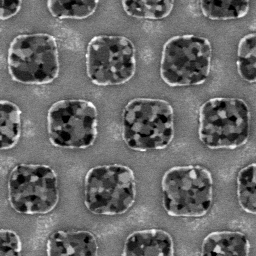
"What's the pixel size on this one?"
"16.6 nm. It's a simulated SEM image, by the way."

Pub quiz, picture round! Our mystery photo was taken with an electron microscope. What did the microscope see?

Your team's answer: a regular array of raised bodies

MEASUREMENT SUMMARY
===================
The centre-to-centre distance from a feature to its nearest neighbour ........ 1.24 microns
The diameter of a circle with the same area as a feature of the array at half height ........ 862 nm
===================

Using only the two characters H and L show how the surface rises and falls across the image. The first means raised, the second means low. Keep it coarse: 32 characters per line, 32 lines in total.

HHLLLLHHHHHHLLLLHHHHHHLLLHHHHHHL
HHLLLLHHHHHHLLLLHHHHHLLLLHHHHHHL
LLLLLLLLLLLLLLLLLLLLLLLLLLLLLLLL
LLLLLLLLLLLLLLLLLLLLLLLLLLLLLLLL
LLLHHHLLLLLLLLLLLLLLLLLLLLLLLLLH
LLHHHHHLLLLHHHHHLLLLLHHHHHLLLLHH
LHHHHHHLLLLHHHHHHLLLHHHHHHLLLLHH
LHHHHHHLLLLHHHHHHLLLHHHHHHLLLLHH
LHHHHHHLLLLHHHHHHLLLHHHHHHLLLLHH
LLHHHHHLLLLHHHHHLLLLHHHHHHLLLLHH
LLLLLLLLLLLLHHHLLLLLLHHHHLLLLLLL
LLLLLLLLLLLLLLLLLLLLLLLLLLLLLLLL
LLLLLLLLLLLLLLLLLHHLLLLLLLHHHHLL
HHLLLLHHHHHHLLLLHHHHHLLLLHHHHHHL
HHLLLLHHHHHHLLLLHHHHHHLLLHHHHHHL
HHHLLLHHHHHHLLLHHHHHHHLLLHHHHHHL
HHHLLLHHHHHHLLLHHHHHHLLLLHHHHHHL
HHLLLLHHHHHHLLLLHHHHHLLLLHHHHHHL
HLLLLLLLLLLLLLLLHHHHLLLLLLLLLLLL
LLLLLLLLLLLLLLLLLLLLLLLLLLLLLLLL
LLLLLLLLLLLLLLLLLLLLLLLLLLLLLLLL
LHHHHHHLLLLHHHHHLLLLLHHHHHLLLLHH
LHHHHHHLLLLHHHHHHLLLHHHHHHLLLLHH
LHHHHHHLLLLHHHHHHLLLHHHHHHLLLLHH
LHHHHHHLLLLHHHHHHLLLHHHHHHLLLLHH
LLHHHHHLLLLHHHHHLLLLHHHHHHLLLLHH
LLHLHHLLLLLHHHHLLLLLLHHHHHLLLLLL
LLLLLLLLLLLLLLLLLLLLLLLLLLLLLLLL
LLLLLLLLLLLLLLLLLLLLLLLLLLLLLLLL
HHLLLLHHHHHHLLLLHHHHHLLLLLHHHHHL
HHLLLLHHHHHHLLLLHHHHHLLLLHHHHHHL
HHLLLLHHHHHHLLLLHHHHHHLLLHHHHHHL